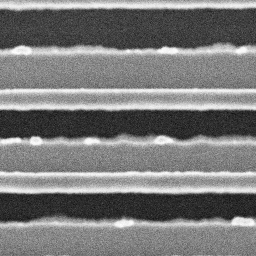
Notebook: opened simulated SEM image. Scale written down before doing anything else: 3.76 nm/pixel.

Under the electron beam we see lines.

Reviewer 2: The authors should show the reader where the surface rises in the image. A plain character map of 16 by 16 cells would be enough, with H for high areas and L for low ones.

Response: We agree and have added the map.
LHLLLLLLLLLLLLLL
LLLLLLLLLLLLLLLL
LLLLLLLLLLLLLLLL
HHHHHHHHHHHHHHHH
HHHHHHHHHHHHHHHH
HHHHHHHHHHHHHHHH
HHHHHHHHHHHHHHHH
LLLLLLLLLLLLLLLL
LLLLLLLLLLLLLLLL
HHHHHHHHHHHHHHHH
HHHHHHHHHHHHHHHH
HHHHHHHHHHHHHHHH
LLLLLLLLLLLLLLLL
LLLLLLLLLLLLLLLL
HHHHHHHHHHHHHHHH
HHHHHHHHHHHHHHHH